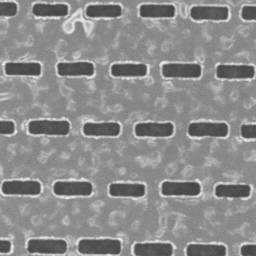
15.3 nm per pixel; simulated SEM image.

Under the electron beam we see a regular array of holes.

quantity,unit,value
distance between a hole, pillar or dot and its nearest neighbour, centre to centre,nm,807